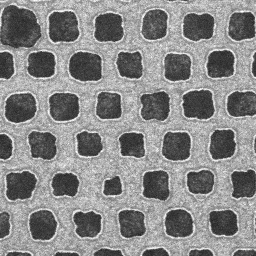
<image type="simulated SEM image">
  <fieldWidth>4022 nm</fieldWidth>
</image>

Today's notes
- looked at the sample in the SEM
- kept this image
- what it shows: a regular array of holes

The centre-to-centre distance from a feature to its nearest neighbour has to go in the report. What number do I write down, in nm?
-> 683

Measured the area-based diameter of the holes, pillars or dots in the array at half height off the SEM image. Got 482 nm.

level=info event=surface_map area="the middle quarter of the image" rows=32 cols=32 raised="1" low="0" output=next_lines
10000000001110000000111110000000
10000000001110000000111110000000
10000000001111000000111110000000
11000000011111110001111110000000
11110000111111111111111111101111
11111111111111111111111111111111
11111111111111111111111101111111
00011111100000111111000000111100
00001111000000011110000000011100
00001111000000111110000000111100
00001111000000111110000000111000
00001111000000011110000000111100
00001111000000011110000000111100
00011111100000111111000000111110
11111111111111111111111111111111
11111111111111111111111111111111
11111111111111111111111111111111
11100000011111100001111110000001
11100000011111000000111110000000
11100000011111000000111100000000
11100000001111000000111100000000
11100000001111000000111100000000
11110000011111000000111100000000
11111111111111111001111110000001
11111111111111111111111111111111
11111111111111111111111111111111
11111111111111111111111011111111
00011111111111111111000000111110
00011111111100111111000000111100
00001111110000111111000000111100
00001111110000011111000000111110
00001111110000011110000000111110